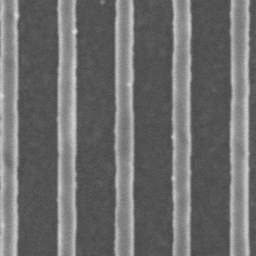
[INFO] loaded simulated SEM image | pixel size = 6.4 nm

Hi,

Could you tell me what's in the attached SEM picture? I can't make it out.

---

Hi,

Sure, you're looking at lines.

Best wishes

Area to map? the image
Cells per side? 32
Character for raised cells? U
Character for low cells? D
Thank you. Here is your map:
UUDDDDDUUDDDDDUUUDDDDDUUDDDDDUUD
UUDDDDDUUDDDDDDUUDDDDDUUDDDDDUUD
UUDDDDDUUDDDDDUUUDDDDDUUDDDDDUUD
UUDDDDDUUDDDDDUUUDDDDDUUDDDDDUUD
UUDDDDDUUDDDDDUUUDDDDDUUDDDDDUUD
UUDDDDDUUDDDDDUUUDDDDDUUDDDDDUUD
UUDDDDDUUDDDDDUUUDDDDDUUDDDDDUUD
UUDDDDDUUDDDDDUUUDDDDDUUDDDDDUUD
UUDDDDDUUDDDDDUUUDDDDDUUDDDDDUUD
UUDDDDDUUDDDDDUUUDDDDDUUDDDDDUUD
UUDDDDDUUDDDDDUUUDDDDDUUDDDDDUUD
UUDDDDDUUDDDDDUUUDDDDDUUDDDDDUUD
UUDDDDDUUDDDDDUUUDDDDDUUDDDDDUUD
UUDDDDDUUDDDDDUUUDDDDDUUDDDDDUUD
UUDDDDDUUDDDDDUUUDDDDDUUDDDDDUUD
UUDDDDDUUDDDDDUUUDDDDDUUDDDDDUUD
UUDDDDDUUDDDDDUUUDDDDDUUDDDDDUUD
UUDDDDDUUDDDDDUUUDDDDDUUDDDDDUUD
UUDDDDDUUDDDDDUUUDDDDDUUDDDDDUUD
UUDDDDDUUDDDDDUUUDDDDDUUDDDDDUUD
UUDDDDDUUDDDDDUUUDDDDDUUDDDDDUUD
UUDDDDDUUDDDDDUUUDDDDDUUDDDDDUUD
UUDDDDDUUDDDDDUUUDDDDDUUDDDDDUUD
UUDDDDDUUDDDDDUUUDDDDDUUDDDDDUUD
UUDDDDDUUDDDDDDUUDDDDDUUDDDDDUUD
UUDDDDDUUDDDDDDUUDDDDDUUDDDDDUUD
UUDDDDDUUDDDDDUUUDDDDDUUDDDDDUUD
UUDDDDDUUDDDDDUUUDDDDDUUDDDDDUUD
UUDDDDDUUDDDDDUUUDDDDDUUDDDDDUUD
UUDDDDDUUDDDDDUUUDDDDDUUDDDDDUUD
UUDDDDDUUDDDDDUUUDDDDDUUDDDDDUUD
UUDDDDDUUDDDDDUUUDDDDDUUDDDDDUUD